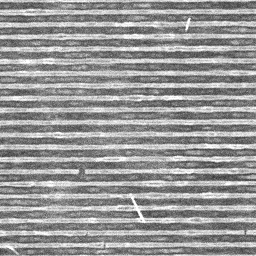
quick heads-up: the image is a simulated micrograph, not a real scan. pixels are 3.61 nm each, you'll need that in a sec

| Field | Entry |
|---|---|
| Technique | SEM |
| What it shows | parallel lines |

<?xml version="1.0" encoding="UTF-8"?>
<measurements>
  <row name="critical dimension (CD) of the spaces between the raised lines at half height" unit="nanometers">32.5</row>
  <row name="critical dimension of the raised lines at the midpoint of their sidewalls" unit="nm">11.7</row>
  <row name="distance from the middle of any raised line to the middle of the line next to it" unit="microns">0.0443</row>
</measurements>